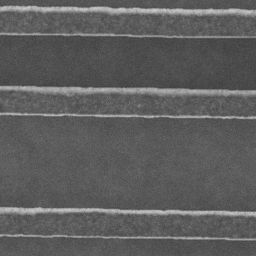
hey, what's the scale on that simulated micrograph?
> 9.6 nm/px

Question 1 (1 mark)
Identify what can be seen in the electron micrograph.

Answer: lines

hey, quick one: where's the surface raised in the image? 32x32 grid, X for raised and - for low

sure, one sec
--------------------------------
XXXXXXXXXXXXXXXXXXXXXXXXXXXXXXXX
XXXXXXXXXXXXXXXXXXXXXXXXXXXXXXXX
XXXXXXXXXXXXXXXXXXXXXXXXXXXXXXXX
----------------XXXXXXXXXXXXXXXX
--------------------------------
--------------------------------
--------------------------------
--------------------------------
--------------------------------
--------------------------------
XXXXXXXXXXXXXXXXXXXXXXXXXXXXXXXX
XXXXXXXXXXXXXXXXXXXXXXXXXXXXXXXX
XXXXXXXXXXXXXXXXXXXXXXXXXXXXXXXX
------------X-XXXXXXXXXXXXXXXXXX
--------------------------------
--------------------------------
--------------------------------
--------------------------------
--------------------------------
--------------------------------
--------------------------------
--------------------------------
--------------------------------
--------------------------------
--------------------------------
XXXXXXXXXXXXXXXXXXXXXXXXXXXX----
XXXXXXXXXXXXXXXXXXXXXXXXXXXXXXXX
XXXXXXXXXXXXXXXXXXXXXXXXXXXXXXXX
-X-XXXXXXXXXXXXXXXXXXXXXXXXXXXXX
--------------------------------
--------------------------------